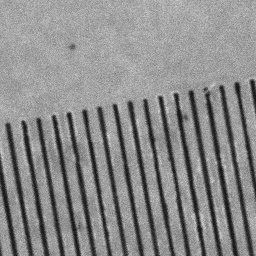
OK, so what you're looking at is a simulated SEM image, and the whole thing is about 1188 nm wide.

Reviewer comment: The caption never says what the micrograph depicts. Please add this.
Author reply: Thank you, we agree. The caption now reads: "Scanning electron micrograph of parallel lines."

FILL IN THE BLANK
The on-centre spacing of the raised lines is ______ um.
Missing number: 0.0719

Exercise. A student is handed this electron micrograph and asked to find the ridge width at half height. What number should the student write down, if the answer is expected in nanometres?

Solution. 50.9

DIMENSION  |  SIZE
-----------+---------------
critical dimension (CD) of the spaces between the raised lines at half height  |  22.8 nanometers